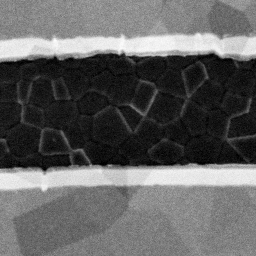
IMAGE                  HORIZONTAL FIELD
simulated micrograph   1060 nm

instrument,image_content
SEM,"one or a few lines or trenches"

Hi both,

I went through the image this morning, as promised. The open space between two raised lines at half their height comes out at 131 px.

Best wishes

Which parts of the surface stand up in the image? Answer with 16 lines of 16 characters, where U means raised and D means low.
UUUUUUUUUUUUUUUU
UUUUUUUUUUUUUUUU
UUUUUUUUUUUUUUUU
DDDDDDDDDDDDDDDD
DDDDDDDDDDDDDDDD
DDDDDDDDDDDDDDDD
DDDDDDDDDDDDDDDD
DDDDDDDDDDDDDDDD
DDDDDDDDDDDDDDDD
DDDDDDDDDDDDDDDD
DDDDDDDDDDDDDDDD
UUUUUUUUUUUUUUUU
UUUUUUUUUUUUUUUU
UUUUUUUUUUUUUUUU
UUUUUUUUUUUUUUUU
UUUUUUUUUUUUUUUU